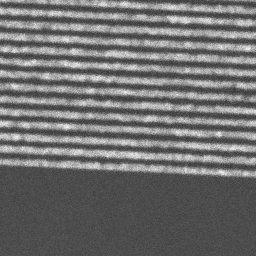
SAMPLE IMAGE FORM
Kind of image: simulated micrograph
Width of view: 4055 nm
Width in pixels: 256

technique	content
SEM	parallel lines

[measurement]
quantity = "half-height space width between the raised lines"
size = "125 nm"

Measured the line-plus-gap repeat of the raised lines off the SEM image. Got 198 nanometers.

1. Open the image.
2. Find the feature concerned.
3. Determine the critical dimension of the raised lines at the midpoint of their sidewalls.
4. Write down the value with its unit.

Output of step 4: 71.2 nm